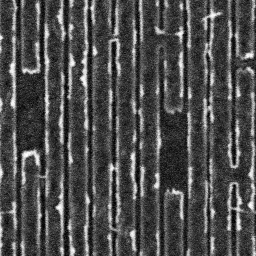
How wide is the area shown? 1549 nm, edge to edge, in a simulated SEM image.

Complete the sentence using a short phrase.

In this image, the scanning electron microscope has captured parallel lines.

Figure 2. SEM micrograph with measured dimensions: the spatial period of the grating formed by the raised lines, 144 nanometers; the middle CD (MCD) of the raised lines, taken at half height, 111 nanometers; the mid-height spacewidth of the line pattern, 33.3 nm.